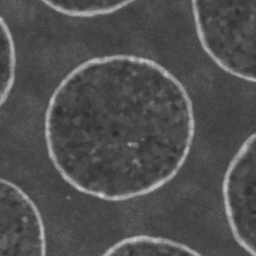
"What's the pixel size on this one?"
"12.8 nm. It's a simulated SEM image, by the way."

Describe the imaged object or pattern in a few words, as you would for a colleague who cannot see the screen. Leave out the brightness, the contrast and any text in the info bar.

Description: raised bodies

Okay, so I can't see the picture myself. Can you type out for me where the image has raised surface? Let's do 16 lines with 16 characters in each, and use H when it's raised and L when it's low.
LLLLHHHLLLLLHHHH
LLLLLLLLLLLLHHHH
HLLLLLLLLLLLLHHH
HLLLLLLLLLLLLHHH
HLLLLHHHHHLLLLLH
HLLLHHHHHHHLLLLL
LLLHHHHHHHHHLLLL
LLLHHHHHHHHHLLLL
LLLHHHHHHHHHLLLL
LLLHHHHHHHHHLLLH
LLLLHHHHHHHLLLHH
HLLLLHHHHHLLLLHH
HHLLLLLLLLLLLLHH
HHLLLLLLLLLLLLHH
HHHLLLLLLLLLLLLH
HHHLLLLHHHHLLLLH